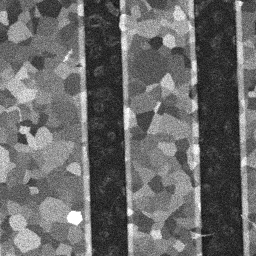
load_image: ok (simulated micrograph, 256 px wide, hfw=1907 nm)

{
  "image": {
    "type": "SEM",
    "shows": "one or a few lines or trenches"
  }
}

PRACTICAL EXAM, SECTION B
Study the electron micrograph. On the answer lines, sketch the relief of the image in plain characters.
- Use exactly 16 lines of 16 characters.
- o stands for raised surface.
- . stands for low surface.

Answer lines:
ooooo...oooo...o
ooooo...oooo...o
ooooo...oooo...o
ooooo...oooo...o
ooooo...oooo...o
ooooo...oooo...o
ooooo...oooo...o
ooooo...oooo...o
ooooo...oooo...o
ooooo...oooo...o
ooooo...oooo...o
ooooo...oooo...o
ooooo...oooo...o
ooooo...oooo...o
ooooo...oooo...o
oooooo..oooo...o